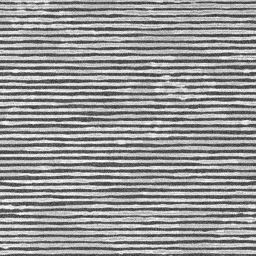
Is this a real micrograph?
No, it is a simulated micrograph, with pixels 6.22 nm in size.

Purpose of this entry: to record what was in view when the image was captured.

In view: parallel lines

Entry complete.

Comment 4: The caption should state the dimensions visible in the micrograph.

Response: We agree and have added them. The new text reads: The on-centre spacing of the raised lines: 40.2 nanometres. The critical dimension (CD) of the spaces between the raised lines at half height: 22.6 nm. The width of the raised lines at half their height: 0.0171 µm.